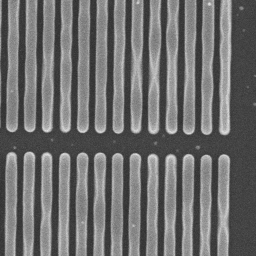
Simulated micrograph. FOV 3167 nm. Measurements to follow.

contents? groups of lines, slits or small figures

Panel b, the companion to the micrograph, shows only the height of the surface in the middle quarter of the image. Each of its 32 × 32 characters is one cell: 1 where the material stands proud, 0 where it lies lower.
11001100111001100110001000110001
11001100111001100110001000110001
11001100111001100110001000110001
11001100111001100110001000110001
11001100110001100110001000110011
11001100110001100110001000110011
10001100110001100110001000110011
10001100110001100110011100110011
10001100110001100110011000110011
10001100110011100110011000110011
10001100110011100110011000110011
10001100110011100110011000110011
10011100110011100110011000110011
10011100110011100110011000110011
10011100110011100110011000110011
10011100110011100110011000110011
10001100110011100110001000110011
00000000000000000000000000000000
00000000000000000000000000000000
00000000000000000000000000000000
00000000000000000000000000000000
00000000000000000000000000000000
00001000010000000000000000000000
10011100110011100110011000110011
10011100110011100110011000110011
10011100110011100110011000110011
10011100110011100110011000110011
10011100110011100110011000110011
10001100110011100110011001110011
10011000110011100110011001110011
10011100110011100110011001110011
10011100110011100110011001110011